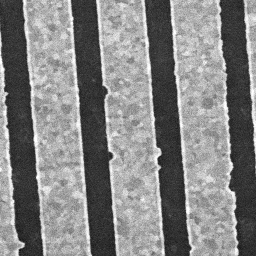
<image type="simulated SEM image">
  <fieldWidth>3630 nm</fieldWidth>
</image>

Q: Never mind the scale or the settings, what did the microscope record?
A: one or a few lines or trenches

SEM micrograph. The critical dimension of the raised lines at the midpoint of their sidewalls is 641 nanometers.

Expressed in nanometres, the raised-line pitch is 1040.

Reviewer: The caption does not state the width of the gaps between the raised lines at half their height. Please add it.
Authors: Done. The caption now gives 390 nm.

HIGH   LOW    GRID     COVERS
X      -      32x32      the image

---XXXXXX---XXXXXX---XXXXXX----X
---XXXXXX---XXXXXX----XXXXX----X
---XXXXXX---XXXXXX----XXXXX----X
---XXXXXX---XXXXXX----XXXXX----X
---XXXXXX----XXXXX----XXXXXX---X
---XXXXXX----XXXXX----XXXXXX---X
---XXXXXX----XXXXX----XXXXXX---X
----XXXXX----XXXXXX---XXXXXX---X
----XXXXX----XXXXXX---XXXXXX---X
----XXXXX----XXXXXX---XXXXXX---X
----XXXXXX---XXXXXX---XXXXXX---X
X---XXXXXX----XXXXX---XXXXXX---X
X---XXXXXX---XXXXXX---XXXXXX----
X---XXXXXX---XXXXXX---XXXXXX----
X---XXXXXX---XXXXXX----XXXXX----
X---XXXXXX---XXXXXX----XXXXX----
X---XXXXXX---XXXXXX----XXXXX----
X---XXXXXX----XXXXX----XXXXXX---
X----XXXXX----XXXXXX---XXXXXX---
X----XXXXX----XXXXXX---XXXXXX---
X----XXXXX----XXXXXX---XXXXXX---
X----XXXXX----XXXXXX---XXXXXX---
X----XXXXXX---XXXXXX---XXXXXX---
X----XXXXXX---XXXXXX---XXXXXX---
X----XXXXXX---XXXXXX---XXXXXX---
XX---XXXXXX---XXXXXX---XXXXXX---
XX---XXXXXX---XXXXXX---XXXXXX---
XX---XXXXXX---XXXXXX---XXXXXX---
XX---XXXXXX---XXXXXX----XXXXX---
XX---XXXXXX----XXXXX----XXXXX---
XXX--XXXXXX----XXXXX----XXXXXX--
XX----XXXXX----XXXXX----XXXXXX--